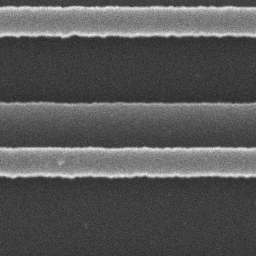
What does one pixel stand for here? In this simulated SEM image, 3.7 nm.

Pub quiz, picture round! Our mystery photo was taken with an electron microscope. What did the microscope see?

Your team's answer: lines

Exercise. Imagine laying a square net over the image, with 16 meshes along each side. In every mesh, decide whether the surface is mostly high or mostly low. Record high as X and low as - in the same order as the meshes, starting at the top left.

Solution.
XXXXXXXXXXXXXXXX
XXXXXXXXXXXXXXXX
----------------
----------------
----------------
----------------
XXXX--XXX---XX--
XXXXXXXXXXXXXXXX
XXXXXXXXXXXXXXXX
XXXXXXXXXXXXXXXX
XXXXXXXXXXXXXXXX
----------------
----------------
----------------
----------------
----------------